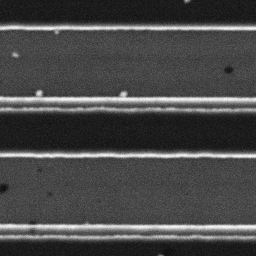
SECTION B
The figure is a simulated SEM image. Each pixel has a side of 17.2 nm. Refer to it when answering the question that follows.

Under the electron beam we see lines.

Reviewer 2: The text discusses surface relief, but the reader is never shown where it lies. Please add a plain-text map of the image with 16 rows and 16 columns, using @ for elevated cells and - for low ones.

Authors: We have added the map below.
@@@@@@@@@@@@@@@@
@@@@@@@@@@@@@@@@
----------------
----------------
----------------
----------------
@@@@@@@@@@@@@@@@
@@@@@@@@@@@@@@@@
@@@@@@@@@@@@@@@@
@@@@@@@@@@@@@@@@
----------------
----------------
----------------
----------------
@@@@@@@@@@@@@@@@
@@@@@@@@@@@@@@@@